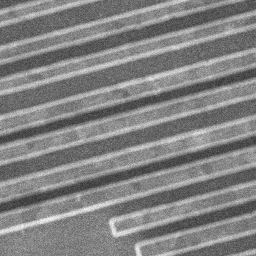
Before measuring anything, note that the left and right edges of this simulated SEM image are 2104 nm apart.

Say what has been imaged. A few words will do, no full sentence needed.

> parallel lines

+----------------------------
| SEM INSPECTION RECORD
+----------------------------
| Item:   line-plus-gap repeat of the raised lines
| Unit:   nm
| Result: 269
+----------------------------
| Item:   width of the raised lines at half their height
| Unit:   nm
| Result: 137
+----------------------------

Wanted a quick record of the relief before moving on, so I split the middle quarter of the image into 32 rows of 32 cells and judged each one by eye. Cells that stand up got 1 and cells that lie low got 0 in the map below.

11111111110000000000000000000000
11111110000000000000000000000111
11100000000000000000000001111111
00000000000000000000001111111111
00000000000000000111111111111111
00000000000000111111111111111000
00000000001111111111111111000000
00000011111111111111100000000000
00011111111111111100000000000011
11111111111111000000000000111111
11111111110000000000000111111111
11111110000000000001111111111111
11100000000000011111111111111100
00000000000111111111111111100000
00000000111111111111111100000000
00001111111111111111000000000000
11111111111111110000000000000000
11111111111100000000000000000001
11111111100000000000000000001111
11111000000000000000000011111111
10000000000000000000111111111111
00000000000000001111111111111111
00000000000001111111111111111000
00000000011111111111111110000000
00000111111111111111100000000000
01111111111111111000000000000011
11111111111111000000000000011111
11111111110000000000001111111111
11111100000000000001111111111111
11000000000000011111111111111110
00000000000111111111111111110000
00000000111111111111111100000000